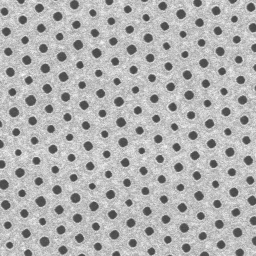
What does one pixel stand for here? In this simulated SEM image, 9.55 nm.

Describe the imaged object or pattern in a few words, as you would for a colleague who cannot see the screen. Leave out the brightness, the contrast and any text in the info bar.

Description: a regular array of holes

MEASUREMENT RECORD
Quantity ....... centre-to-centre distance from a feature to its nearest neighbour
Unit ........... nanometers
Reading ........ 192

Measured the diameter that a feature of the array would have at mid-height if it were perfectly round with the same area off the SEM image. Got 83.9 nanometres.